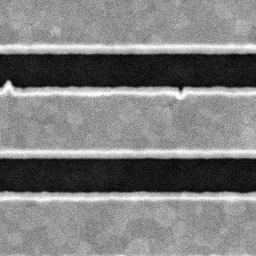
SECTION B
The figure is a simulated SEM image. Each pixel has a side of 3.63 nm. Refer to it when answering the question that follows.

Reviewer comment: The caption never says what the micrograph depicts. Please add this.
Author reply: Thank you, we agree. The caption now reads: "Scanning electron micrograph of one or a few lines or trenches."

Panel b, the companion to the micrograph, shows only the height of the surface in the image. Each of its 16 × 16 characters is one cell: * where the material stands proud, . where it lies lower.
****************
****************
****************
................
................
*...............
****************
****************
****************
****************
................
................
****************
****************
****************
****************